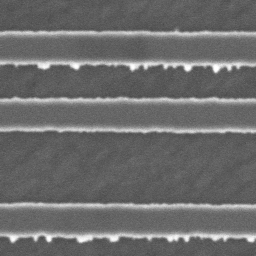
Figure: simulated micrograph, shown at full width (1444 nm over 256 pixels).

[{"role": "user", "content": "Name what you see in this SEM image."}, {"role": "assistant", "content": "lines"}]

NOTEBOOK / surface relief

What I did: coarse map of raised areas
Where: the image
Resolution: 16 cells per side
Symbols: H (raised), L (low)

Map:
LLLLLLLLLLLLLLLL
LLLLLLLLLLLLLLLL
HHHHHHHHHHHHHHHH
HHHHHHHHHHHHHHHH
LLLLLLLLLLLLLLLL
LLLLLLLLLLLLLLLL
HHHHHHHHHHHHHHHH
HHHHHHHHHHHHHHHH
LLLLLLLLLLLLLLLL
LLLLLLLLLLLLLLLL
LLLLLLLLLLLLLLLL
LLLLLLLLLLLLLLLL
LLLLLLLLLLLLLLLL
HHHHHHHHHHHHHHHH
HHHHHHHHHHHHHHHH
LLLLLLLLLLLLLLLL